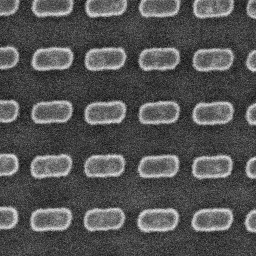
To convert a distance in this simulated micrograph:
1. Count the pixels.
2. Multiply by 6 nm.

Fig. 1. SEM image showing a regular array of raised bodies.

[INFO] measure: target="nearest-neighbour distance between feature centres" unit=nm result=319